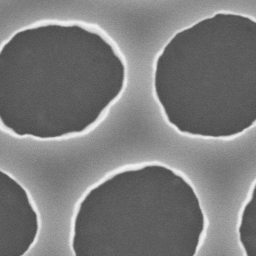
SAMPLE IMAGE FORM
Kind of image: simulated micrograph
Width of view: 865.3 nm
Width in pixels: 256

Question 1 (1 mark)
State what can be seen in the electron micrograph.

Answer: holes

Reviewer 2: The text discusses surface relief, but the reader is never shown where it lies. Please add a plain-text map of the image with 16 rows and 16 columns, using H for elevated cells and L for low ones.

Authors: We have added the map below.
HHHHHHHHHHHHHHHH
HHHHHHHHHHHHLLLL
HLLLLLLHHHHLLLLL
LLLLLLLHHHLLLLLL
LLLLLLLLHHLLLLLL
LLLLLLLLHHLLLLLL
LLLLLLLHHHLLLLLL
LLLLLLHHHHHLLLLL
HHLLHHHHHHHHHLHH
HHHHHHHHHHHHHHHH
HHHHHHHHHLHHHHHH
LHHHHHLLLLLLHHHH
LLHHHLLLLLLLHHHH
LLHHHLLLLLLLLHHL
LLHHHLLLLLLLLHHL
LLHHHLLLLLLLHHHL